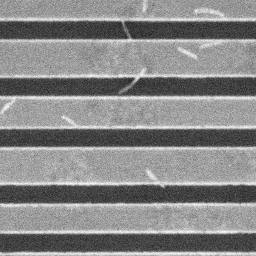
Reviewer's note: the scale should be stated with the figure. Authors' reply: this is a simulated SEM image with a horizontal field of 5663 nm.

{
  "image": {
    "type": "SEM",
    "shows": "lines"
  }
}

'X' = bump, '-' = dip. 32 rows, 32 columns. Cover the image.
XXXXXXXXXXXXXXXXXXXXXXXXXXXXXXXX
XXXXXXXXXXXXXXXXXXXXXXXXXXXXXXXX
---------------X------X--------X
--------------------------------
--------------------------------
XXXXXXXXXXXXXXXXXXXXXXXXXXXXXXXX
XXXXXXXXXXXXXXXXXXXXXXXXXXXXXXXX
XXXXXXXXXXXXXXXXXXXXXXXXXXXXXXXX
XXXXXXXXXXXXXXXXXXXXXXXXXXXXXXXX
XXXXXXXXXXXXXXXXXXXXXXXXXXXXXXXX
--------------------------------
--------------------------------
XXXXXXXXXXXXXXXXXXXXXXXXXXXXXXXX
XXXXXXXXXXXXXXXXXXXXXXXXXXXXXXXX
XXXXXXXXXXXXXXXXXXXXXXXXXXXXXXXX
XXXXXXXXXXXXXXXXXXXXXXXXXXXXXXXX
--------------------------------
--------------------------------
-XXXXXXXXXXXXXXXXXXXXXXXXXXXXXXX
XXXXXXXXXXXXXXXXXXXXXXXXXXXXXXXX
XXXXXXXXXXXXXXXXXXXXXXXXXXXXXXXX
XXXXXXXXXXXXXXXXXXXXXXXXXXXXXXXX
XXXXXXXXXXXXXXXXXXXXXXXXXXXXXXXX
--------------------------------
--------------------------------
--------------------------------
XXXXXXXXXXXXXXXXXXXXXXXXXXXXXXXX
XXXXXXXXXXXXXXXXXXXXXXXXXXXXXXXX
XXXXXXXXXXXXXXXXXXXXXXXXXXXXXXXX
--------------------------------
--------------------------------
--------------------------------